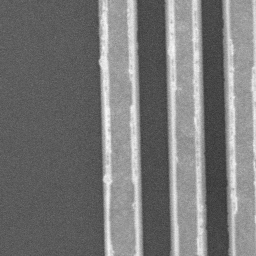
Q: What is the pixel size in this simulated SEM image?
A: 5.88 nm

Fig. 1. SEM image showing one or a few lines or trenches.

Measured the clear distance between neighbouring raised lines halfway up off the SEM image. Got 195 nm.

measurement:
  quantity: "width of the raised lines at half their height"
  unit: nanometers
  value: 163